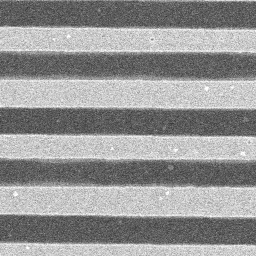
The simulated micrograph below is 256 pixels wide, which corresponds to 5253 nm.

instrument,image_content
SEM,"lines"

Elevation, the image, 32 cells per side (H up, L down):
LLLLLLLLLLLLLLLLLLLLLLLLLLLLLLLL
LLLLLLLLLLLLLLLLLLLLLLLLLLLLLLLL
LLLLLLLLLLLLLLLLLLLLLLLLLLLLLLLL
HHHHHHLLLLLLLLLLLLLLLLLLLLLLLLLL
HHHHHHHHHHHHHHHHHHHHHHHHHHHHHHHH
HHHHHHHHHHHHHHHHHHHHHHHHHHHHHHHH
LLLLLLLLLLLLLLLLLLLLLLLHLHHLHHHH
LLLLLLLLLLLLLLLLLLLLLLLLLLLLLLLL
LLLLLLLLLLLLLLLLLLLLLLLLLLLLLLLL
LLLLLLLLLLLLLLLLLLLLLLLLLLLLLLLL
HHHHHHHHHHHHHHHHHHHHHHHHHHHHHHHH
HHHHHHHHHHHHHHHHHHHHHHHHHHHHHHHH
HHHHHHHHHHHHHHHHHHHHHHHHHHHHHHHH
LLLLLLLLLLLLLLLLLLLLLLLLLLLLLLHH
LLLLLLLLLLLLLLLLLLLLLLLLLLLLLLLL
LLLLLLLLLLLLLLLLLLLLLLLLLLLLLLLL
LLLLLLLLLLLLLLLLLLLLLLLLLLLLLLLL
HHHHHHHHHHHHHHHHHHHHHHHHHHHHHHHH
HHHHHHHHHHHHHHHHHHHHHHHHHHHHHHHH
HHHHHHHHHHHHHHHHHHHHHHHHHHHHHHHH
LLLLLLLLLLLLLLLLLLLLLLLLLLLLLLLL
LLLLLLLLLLLLLLLLLLLLLLLLLLLLLLLL
LLLLLLLLLLLLLLLLLLLLLLLLLLLLLLLL
HHHHHHHHHHHHHHHHHHHHHHHHHLHHHLLL
HHHHHHHHHHHHHHHHHHHHHHHHHHHHHHHH
HHHHHHHHHHHHHHHHHHHHHHHHHHHHHHHH
HHHHHHHHHHHHHHHHHHHHHHHHHHHHHHHH
LLLLLLLLLLLLLLLLLLLLLLLLLLLLLLLL
LLLLLLLLLLLLLLLLLLLLLLLLLLLLLLLL
LLLLLLLLLLLLLLLLLLLLLLLLLLLLLLLL
HHHHHHHHLLLLLLLLLLLLLLLLLLLLLLLL
HHHHHHHHHHHHHHHHHHHHHHHHHHHHHHHH